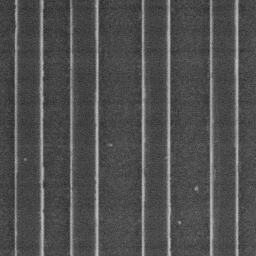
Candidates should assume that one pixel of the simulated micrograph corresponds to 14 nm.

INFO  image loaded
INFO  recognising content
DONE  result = lines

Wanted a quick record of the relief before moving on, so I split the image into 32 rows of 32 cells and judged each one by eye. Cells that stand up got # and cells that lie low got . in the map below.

..###....###......###.....####..
..###....###......###.....####..
..###....###......###.....####..
..###....###......###.....####..
..###....###......###.....####..
..###....###......###.....####..
..###....###......###.....####..
..###....###......###.....####..
..###....###......###.....####..
..###....###......###.....####..
..###....###......###.....####..
..###....###......###.....####..
..###....###......###.....####..
..###....###......###.....####..
..###....###......###.....####..
..###....###......###.....####..
..###....###......###.....####..
..###....###......###.....####..
..###....###......###.....####..
..###....###......###.....####..
..###....###......###.....####..
..###....###......###.....####..
..###....###......###.....####..
..###....###......###.....####..
..###....###......###.....####..
..###....###......###.....####..
..###....###......###.....####..
..###....###......###.....####..
..###....###......###.....####..
..###....###......###.....####..
..###....###......###.....####..
..###....###......###.....####..